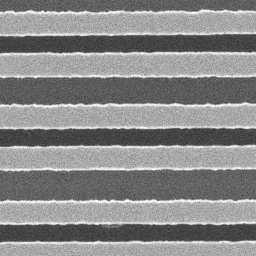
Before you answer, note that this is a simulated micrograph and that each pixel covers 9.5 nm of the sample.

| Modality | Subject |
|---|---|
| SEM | lines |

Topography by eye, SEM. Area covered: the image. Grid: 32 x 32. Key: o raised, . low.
................................
.o.oooo.o.o...oo.oo.oooooooooooo
oooooooooooooooooooooooooooooooo
oooooooooooooooooooooooooooooooo
o.o.............................
................................
................................
oooooooooooooooooooooooooooooooo
oooooooooooooooooooooooooooooooo
oooooooooooooooooooooooooooooooo
................................
................................
................................
oooooooooooooooooooooooooooooooo
oooooooooooooooooooooooooooooooo
oooooooooooooooooooooooooooooooo
................................
................................
oooooooooooooooooooooooooooooooo
oooooooooooooooooooooooooooooooo
oooooooooooooooooooooooooooooooo
................................
................................
................................
................................
oooooooooooooooooooooooooooooooo
oooooooooooooooooooooooooooooooo
oooooooooooooooooooooooooooooooo
................................
................................
oooooooooooooooooooooooooooooooo
oooooooooooooooooooooooooooooooo